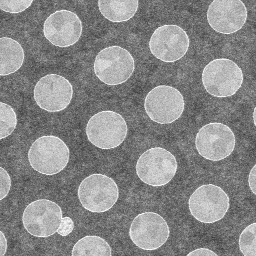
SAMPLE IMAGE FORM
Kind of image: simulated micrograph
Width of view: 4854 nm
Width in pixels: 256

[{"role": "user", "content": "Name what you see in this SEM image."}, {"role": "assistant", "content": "a regular array of raised bodies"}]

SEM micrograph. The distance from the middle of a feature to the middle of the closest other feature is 1180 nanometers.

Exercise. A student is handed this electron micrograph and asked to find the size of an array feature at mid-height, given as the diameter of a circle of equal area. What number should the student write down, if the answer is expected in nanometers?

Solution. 732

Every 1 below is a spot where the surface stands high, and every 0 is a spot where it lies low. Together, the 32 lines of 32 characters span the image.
11110000000011111000000000111100
01000001100001111000000000111110
00000011110000110000000000111110
00000011110000000000111000011100
00000011110000000001111000000000
11000001100000000001111100000000
11100000000001110001111000000000
11100000000011111000110000011000
11000000000011111000000000111100
00000010000011110000000001111100
00000111100001100000000001111100
00001111100000000001110000111000
00001111100000000011111000000000
10000111000000000011111000000000
11000000000011100001110000000000
11000000000111110000000000110000
10000000000111110000000001111000
00000111000111100000000001111000
00001111000001000000000001111000
00001111100000000011110001110000
00001111000000000111110000000000
10000110000000000111110000000001
10000000000111000011100000000001
10000000001111100000000001100001
10000000001111100000000011110000
00001110001111000000000011111000
00011111000000000000000011110000
00011111100000000111000001100000
00011111100000001111100000000001
00000100000000001111100000000011
10000000001110000111000000000011
10000000011111000000000011100011